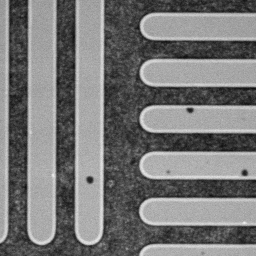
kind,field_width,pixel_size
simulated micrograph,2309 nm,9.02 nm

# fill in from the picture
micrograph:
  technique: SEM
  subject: groups of lines, slits or small figures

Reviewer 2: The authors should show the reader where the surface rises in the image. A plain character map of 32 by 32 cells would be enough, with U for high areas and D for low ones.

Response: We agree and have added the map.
UDDDUUUDDDUUUDDDDDDDDDDDDDDDDDDD
UDDDUUUDDDUUUDDDDDDDDDDDDDDDDDDD
UDDDUUUDDDUUUDDDDDUUUUUUUUUUUUUU
UDDDUUUDDDUUUDDDDDUUUUUUUUUUUUUU
UDDDUUUDDDUUUDDDDDUUUUUUUUUUUUUU
UDDDUUUDDDUUUDDDDDDDDDDDDDDDDDDD
UDDDUUUDDDUUUDDDDDDDDDDDDDDDDDDD
UDDDUUUDDDUUUDDDDDDDDDDDDDDDDDDD
UDDDUUUDDDUUUDDDDDUUUUUUUUUUUUUU
UDDDUUUDDDUUUDDDDDUUUUUUUUUUUUUU
UDDDUUUDDDUUUDDDDDDUUUUUUUUUUUUU
UDDDUUUDDDUUUDDDDDDDDDDDDDDDDDDD
UDDDUUUDDDUUUDDDDDDDDDDDDDDDDDDD
UDDDUUUDDDUUUDDDDDDUUUUUUUUUUUUU
UDDDUUUDDDUUUDDDDDUUUUUUUUUUUUUU
UDDDUUUDDDUUUDDDDDUUUUUUUUUUUUUU
UDDDUUUDDDUUUDDDDDDDDDDDDDDDDDDD
UDDDUUUDDDUUUDDDDDDDDDDDDDDDDDDD
UDDDUUUDDDUUUDDDDDDDDDDDDDDDDDDD
UDDDUUUDDDUUUDDDDDUUUUUUUUUUUUUU
UDDDUUUDDDUUUDDDDDUUUUUUUUUUUUUU
UDDDUUUDDDUUUDDDDDUUUUUUUUUUUUUU
UDDDUUUDDDUUUDDDDDDDDDDDDDDDDDDD
UDDDUUUDDDUUUDDDDDDDDDDDDDDDDDDD
UDDDUUUDDDUUUDDDDDDDDDDDDDDDDDDD
UDDDUUUDDDUUUDDDDDUUUUUUUUUUUUUU
UDDDUUUDDDUUUDDDDDUUUUUUUUUUUUUU
UDDDUUUDDDUUUDDDDDUUUUUUUUUUUUUU
UDDDUUUDDDUUUDDDDDDDDDDDDDDDDDDD
UDDDUUUDDDUUUDDDDDDDDDDDDDDDDDDD
DDDDDDDDDDDDDDDDDDDDDDDDDDDDDDDD
DDDDDDDDDDDDDDDDDDUUUUUUUUUUUUUU